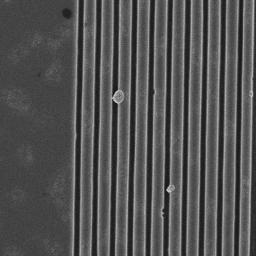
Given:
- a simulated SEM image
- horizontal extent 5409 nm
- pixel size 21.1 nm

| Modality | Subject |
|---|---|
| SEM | parallel lines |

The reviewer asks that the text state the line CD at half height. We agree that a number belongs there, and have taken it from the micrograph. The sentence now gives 248 nm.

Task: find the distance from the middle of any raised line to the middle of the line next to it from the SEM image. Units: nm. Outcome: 373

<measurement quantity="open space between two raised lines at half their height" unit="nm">124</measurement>